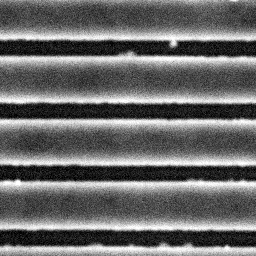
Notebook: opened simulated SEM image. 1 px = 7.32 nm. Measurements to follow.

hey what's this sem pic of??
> lines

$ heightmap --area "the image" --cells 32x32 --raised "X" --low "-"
XXXXXXXXXXXXXXXXXXXXXXXXXXXXXXXX
XXXXXXXXXXXXXXXXXXXXXXXXXXXXXXXX
XXXXXXXXXXXXXXXXXXXXXXXXXXXXXXXX
XXXXXXXXXXXXXXXXXXXXXXXXXXXXXXXX
XXXXXXXXXXXXXXXXXXXXXXXXXXXXXXXX
--------------------------------
--------------------------------
XXXXXXXXXXXXXXXXXXXXXXXXXXXXXXXX
XXXXXXXXXXXXXXXXXXXXXXXXXXXXXXXX
XXXXXXXXXXXXXXXXXXXXXXXXXXXXXXXX
XXXXXXXXXXXXXXXXXXXXXXXXXXXXXXXX
XXXXXXXXXXXXXXXXXXXXXXXXXXXXXXXX
XXXXXXXXXXXXXXXXXXXXXXXXXXXXXXXX
--------------------------------
--------------------------------
XXXXXXXXXXXXXXXXXXXXXXXXXXXXXXXX
XXXXXXXXXXXXXXXXXXXXXXXXXXXXXXXX
XXXXXXXXXXXXXXXXXXXXXXXXXXXXXXXX
XXXXXXXXXXXXXXXXXXXXXXXXXXXXXXXX
XXXXXXXXXXXXXXXXXXXXXXXXXXXXXXXX
-XXXXXXXXXXXXXXXXXXXXXXXXXXXXXXX
--------------------------------
--------------------------------
XXXXXXXXXXXXXXXXXXXXXXXXXXXXXXXX
XXXXXXXXXXXXXXXXXXXXXXXXXXXXXXXX
XXXXXXXXXXXXXXXXXXXXXXXXXXXXXXXX
XXXXXXXXXXXXXXXXXXXXXXXXXXXXXXXX
XXXXXXXXXXXXXXXXXXXXXXXXXXXXXXXX
XXXXXXXXXXXXXXXXXXXXXXXXXXXXXXXX
--------------------------------
--------------------------------
XXXXXXXXXXXXXXXXXXXXXXXXXXXXXXXX